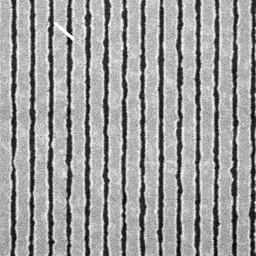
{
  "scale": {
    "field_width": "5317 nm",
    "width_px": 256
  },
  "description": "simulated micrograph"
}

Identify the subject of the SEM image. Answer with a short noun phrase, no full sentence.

parallel lines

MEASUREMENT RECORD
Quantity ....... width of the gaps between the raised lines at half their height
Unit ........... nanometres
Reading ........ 132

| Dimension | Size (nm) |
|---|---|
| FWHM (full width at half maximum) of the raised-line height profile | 265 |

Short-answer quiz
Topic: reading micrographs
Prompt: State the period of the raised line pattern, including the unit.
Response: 382 nm